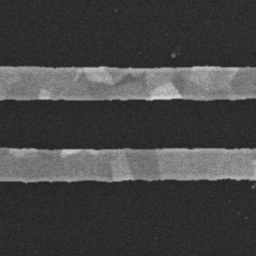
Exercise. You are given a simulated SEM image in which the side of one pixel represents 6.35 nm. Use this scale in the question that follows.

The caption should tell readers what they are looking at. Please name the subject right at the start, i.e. lines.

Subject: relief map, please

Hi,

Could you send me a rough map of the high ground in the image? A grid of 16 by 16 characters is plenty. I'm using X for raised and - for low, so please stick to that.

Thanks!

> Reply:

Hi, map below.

----------------
----------------
----------------
----------------
XXXXXXXXXXXXXXXX
XXXXXXXXXXXXXXXX
----------------
----------------
----------------
XXXXXXXXX-XXXXXX
XXXXXXXXXXXXXXXX
----------------
----------------
----------------
----------------
----------------